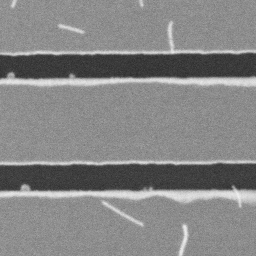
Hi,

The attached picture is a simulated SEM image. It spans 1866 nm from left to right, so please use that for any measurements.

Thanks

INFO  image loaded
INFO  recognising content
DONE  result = lines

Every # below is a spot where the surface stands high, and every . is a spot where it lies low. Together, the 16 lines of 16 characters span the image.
################
################
################
................
................
################
################
################
################
################
................
................
################
################
################
################